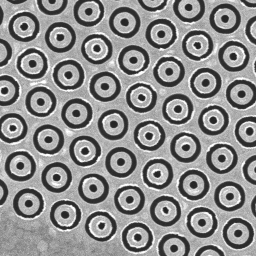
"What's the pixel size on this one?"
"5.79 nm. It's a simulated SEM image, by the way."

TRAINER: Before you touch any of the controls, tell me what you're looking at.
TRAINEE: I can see a regular array of ring-shaped grooves with a dot in the middle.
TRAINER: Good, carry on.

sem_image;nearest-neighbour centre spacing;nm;217